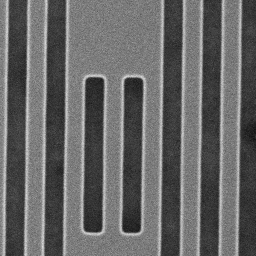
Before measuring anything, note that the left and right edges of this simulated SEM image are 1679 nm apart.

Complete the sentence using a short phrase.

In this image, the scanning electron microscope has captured groups of lines, slits or small figures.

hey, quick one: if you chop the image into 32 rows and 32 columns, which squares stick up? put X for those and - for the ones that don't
X--XXX--XXXXXXXXXXXX---XX---XX--
X--XXX--XXXXXXXXXXXX---XX---XX--
X--XXX--XXXXXXXXXXXX---XX---XX--
X--XXX--XXXXXXXXXXXX---XX---XX--
X--XXX--XXXXXXXXXXXX---XX---XX--
X--XXX--XXXXXXXXXXXX---XX---XX--
X--XXX--XXXXXXXXXXXX---XX---XX--
X--XXX--XXXXXXXXXXXX---XX---XX--
X--XXX--XXXXXXXXXXXX---XX---XX--
X--XXX--XXXXXXXXXXXX---XX---XX--
X--XXX--XXX--XX---XX---XX---XX--
X--XXX--XXX--XX---XX---XX---XX--
X--XXX--XXX--XX---XX---XX---XX--
X--XXX--XXX--XX---XX---XX---XX--
X--XXX--XXX--XX---XX---XX---XX--
X--XXX--XX---XX---XX---XX---XX--
X--XXX--XX---XX---XX---XX---XX--
X--XXX--XX---XX---XX---XX---XX--
X--XXX--XX---XX---XX---XX---XX--
X--XXX--XX---XX---XX---XX---XX--
X--XXX--XX---XX---XX---XX---XX--
X--XXX--XX---XX---XX---XX---XX--
X--XXX--XX---XX---XX---XX---XX--
X--XXX--XX---XX---XX---XX---XX--
X--XXX--XX---XX---XX---XX---XX--
X--XXX--XX---XX---XX---XX--XXX--
X--XXX--XX---XX---XX---XX--XXX--
X--XXX--XX---XX---XX---XX--XXX--
X--XXX--XX---XX---XX---XX--XXX--
X--XX---XXXXXXXXXXXX---XX--XXX--
X--XX---XXXXXXXXXXXX---XX--XXX--
X--XX---XXXXXXXXXXXX---XX--XXX--